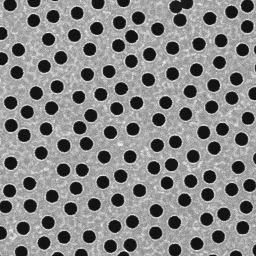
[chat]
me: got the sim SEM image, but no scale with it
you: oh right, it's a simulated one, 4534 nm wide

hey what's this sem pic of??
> a regular array of holes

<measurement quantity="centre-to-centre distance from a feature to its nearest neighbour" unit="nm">373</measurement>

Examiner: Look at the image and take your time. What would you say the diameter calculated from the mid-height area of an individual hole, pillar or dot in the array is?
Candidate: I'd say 236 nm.